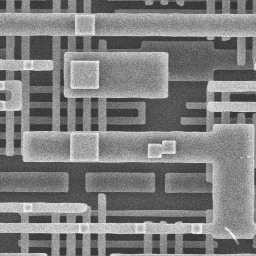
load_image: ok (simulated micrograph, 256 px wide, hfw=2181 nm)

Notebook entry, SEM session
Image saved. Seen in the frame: wiring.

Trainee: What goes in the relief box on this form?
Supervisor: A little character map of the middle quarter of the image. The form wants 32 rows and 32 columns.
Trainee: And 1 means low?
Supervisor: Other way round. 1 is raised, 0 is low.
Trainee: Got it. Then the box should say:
11111111111111111111111111000000
11111111111111111111111111000000
11111111111111111111111111000000
11111111111111111111111111000000
11111111111111111111111111000000
11111111111111111111111111000000
11111111111111111111111111000000
11111111111111111111111111000000
01100110111000000000000000000000
01100110011000000000000000000000
01100110011000000000000000000000
01100110011000000000000000000000
01100110011000000000000000000000
01100110011000000000000000000000
01100110011000000000000000000000
01100110011000000000000000000000
01100110011000000000000000000000
11111111111111111111111111111111
11111111111111111111111111111111
11111111111111111111111111111111
11111111111111111111111111111111
11111111111111111111111111111111
11111111111111111111111111111111
11111111111111111111111111111111
00011111111111110001111111111111
00000000000000000000000000000000
00000000000000000000000000000000
00000000000000000000000000000000
00000000000000000000000000000000
00000000000000000000000000000000
00000000000000000000000000000000
00000000000000000000000000000000